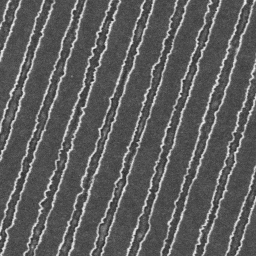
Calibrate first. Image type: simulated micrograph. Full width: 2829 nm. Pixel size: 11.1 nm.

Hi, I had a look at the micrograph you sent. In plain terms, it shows parallel lines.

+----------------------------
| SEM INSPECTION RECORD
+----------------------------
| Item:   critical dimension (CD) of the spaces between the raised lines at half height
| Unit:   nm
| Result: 91.7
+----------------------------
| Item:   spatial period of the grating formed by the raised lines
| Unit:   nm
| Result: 352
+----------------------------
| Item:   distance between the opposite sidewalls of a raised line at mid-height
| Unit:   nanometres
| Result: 256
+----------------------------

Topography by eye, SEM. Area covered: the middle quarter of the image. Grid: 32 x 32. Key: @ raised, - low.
@@@@@@---@@@@@@--@@@@@@--@@@@@@-
@@@@@@--@@@@@@@--@@@@@---@@@@@@-
@@@@@---@@@@@@--@@@@@@---@@@@@@-
@@@@@---@@@@@@--@@@@@@--@@@@@@--
@@@@@--@@@@@@@--@@@@@@--@@@@@@--
@@@@@--@@@@@@--@@@@@@@--@@@@@---
@@@@@--@@@@@@--@@@@@@--@@@@@@---
@@@@--@@@@@@---@@@@@@--@@@@@@--@
@@@@--@@@@@@--@@@@@@---@@@@@@--@
@@@---@@@@@@--@@@@@@--@@@@@@---@
@@@--@@@@@@---@@@@@@--@@@@@@--@@
@@@--@@@@@@--@@@@@@---@@@@@@--@@
@@---@@@@@@--@@@@@@---@@@@@--@@@
@@--@@@@@@---@@@@@@--@@@@@@--@@@
@---@@@@@@--@@@@@@---@@@@@@--@@@
@---@@@@@@--@@@@@@--@@@@@@---@@@
@--@@@@@@---@@@@@@--@@@@@@--@@@@
---@@@@@@--@@@@@@---@@@@@---@@@@
--@@@@@@@--@@@@@@--@@@@@@---@@@@
--@@@@@@---@@@@@@--@@@@@@---@@@@
--@@@@@@--@@@@@@---@@@@@---@@@@@
--@@@@@@--@@@@@@--@@@@@@---@@@@@
-@@@@@@---@@@@@@--@@@@@@--@@@@@@
-@@@@@@--@@@@@@--@@@@@@@--@@@@@@
-@@@@@---@@@@@@--@@@@@@---@@@@@@
-@@@@@---@@@@@@--@@@@@@--@@@@@@-
@@@@@@--@@@@@@--@@@@@@@--@@@@@@-
@@@@@---@@@@@@--@@@@@@@--@@@@@@-
@@@@@---@@@@@@--@@@@@@---@@@@@--
@@@@@--@@@@@@---@@@@@@--@@@@@@--
@@@@---@@@@@@--@@@@@@@--@@@@@---
@@@@@-@@@@@@---@@@@@@---@@@@@--@